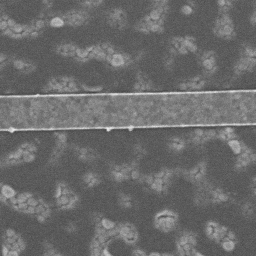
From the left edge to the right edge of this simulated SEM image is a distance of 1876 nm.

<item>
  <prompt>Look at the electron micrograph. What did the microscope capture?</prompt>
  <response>one or a few lines or trenches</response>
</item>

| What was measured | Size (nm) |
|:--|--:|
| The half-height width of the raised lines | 244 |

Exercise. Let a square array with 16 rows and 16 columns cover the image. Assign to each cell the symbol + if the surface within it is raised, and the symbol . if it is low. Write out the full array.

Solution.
................
................
................
................
................
................
++++++++++++++++
++++++++++++++++
................
................
................
................
................
................
................
................